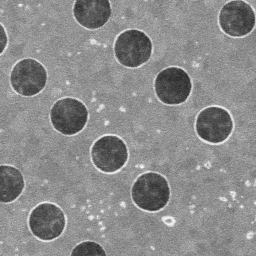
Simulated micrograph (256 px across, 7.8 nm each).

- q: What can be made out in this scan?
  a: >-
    a regular array of holes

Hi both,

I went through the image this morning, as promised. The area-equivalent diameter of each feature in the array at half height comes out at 299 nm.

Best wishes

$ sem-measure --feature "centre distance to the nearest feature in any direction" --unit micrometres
0.434